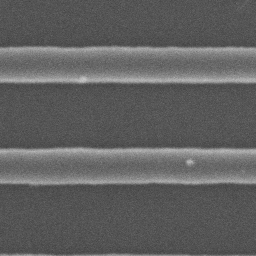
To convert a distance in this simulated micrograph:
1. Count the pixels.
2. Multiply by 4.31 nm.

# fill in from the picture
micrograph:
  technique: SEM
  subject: lines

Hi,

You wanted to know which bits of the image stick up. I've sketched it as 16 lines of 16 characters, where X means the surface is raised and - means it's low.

----------------
----------------
----------------
XXXXXXXXXXXXXXXX
XXXXXXXXXXXXXXXX
----------------
----------------
----------------
----------------
XXXXXXXXXXXXXXXX
XXXXXXXXXXXXXXXX
----------------
----------------
----------------
----------------
----------------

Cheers